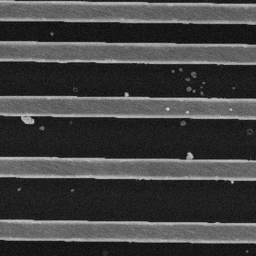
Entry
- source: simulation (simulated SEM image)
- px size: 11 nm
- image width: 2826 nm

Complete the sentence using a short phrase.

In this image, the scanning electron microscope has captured lines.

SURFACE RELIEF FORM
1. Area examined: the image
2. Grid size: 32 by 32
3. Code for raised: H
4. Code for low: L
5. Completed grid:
HHHHHHHHHHHHHHHHHHHHHHHHHHHLLLLL
HHHHHHHHHHHHHHHHHHHHHHHHHHHHHHHH
HHHHHHHHHHHHHHHHHHHHHHHHHHHHHHHH
LLLLLLLLLLLLLLLLLLLLLLLLLLLLLLLL
LLLLLLLLLLLLLLLLLLLLLLLLLLLLLLLL
HHHHHHHHHHHHHHHHHHHHHHLLLLLLLLLL
HHHHHHHHHHHHHHHHHHHHHHHHHHHHHHHH
HHHHHHHHHHHHHHHHHHHHHHHHHHHHHHHH
LLLLLLLLLLLLLLLLLLLLLLLLLLLLLLLL
LLLLLLLLLLLLLLLLLLLLLLLLLLLLLLLL
LLLLLLLLLLLLLLLLLLLLLLLLLLLLLLLL
LLLLLLLLLLLLLLLLLLLLLLLLLLLLLLLL
HHHHHHHHHHHHHHHHHHHHHHHHHHHHHHHH
HHHHHHHHHHHHHHHHHHHHHHHHHHHHHHHH
LLLLLLHHHHHHHHHHHHHHHHHHHHHHHHHH
LLLLLLLLLLLLLLLLLLLLLLLLLLLLLLLL
LLLLLLLLLLLLLLLLLLLLLLLLLLLLLLLL
LLLLLLLLLLLLLLLLLLLLLLLLLLLLLLLL
LLLLLLLLLLLLLLLLLLLLLLLLLLLLLLLL
LLLLLLLLLLLLLLLLLLLLLLLLLLLLLLLL
HHHHHHHHHHHHHHHHHHHHHHHHHHHHHHHH
HHHHHHHHHHHHHHHHHHHHHHHHHHHHHHHH
LLLLLLLLLLLLLLLLLLLLLLLLLLLLLHHH
LLLLLLLLLLLLLLLLLLLLLLLLLLLLLLLL
LLLLLLLLLLLLLLLLLLLLLLLLLLLLLLLL
LLLLLLLLLLLLLLLLLLLLLLLLLLLLLLLL
LLLLLLLLLLLLLLLLLLLLLLLLLLLLLLLL
LLLLLLLLLLLLLLLLLLLLLLLLLLLLLLLL
HHHHHHHHHHHHHHHHHHHHHHHHHHHHHHHH
HHHHHHHHHHHHHHHHHHHHHHHHHHHHHHHH
LLLLLLLLLLLLLLLLLLLLLLLLLLLLLLLL
LLLLLLLLLLLLLLLLLLLLLLLLLLLLLLLL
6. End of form